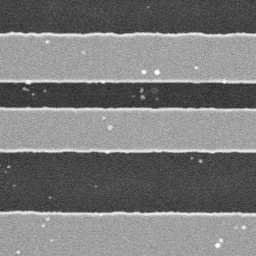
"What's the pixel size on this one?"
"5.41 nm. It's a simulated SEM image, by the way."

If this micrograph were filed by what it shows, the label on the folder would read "lines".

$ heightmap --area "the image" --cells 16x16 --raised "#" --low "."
................
................
################
################
################
................
................
################
################
......#......#..
................
................
................
################
################
################